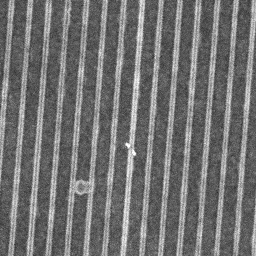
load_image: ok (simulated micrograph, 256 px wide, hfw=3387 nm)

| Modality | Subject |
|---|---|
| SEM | parallel lines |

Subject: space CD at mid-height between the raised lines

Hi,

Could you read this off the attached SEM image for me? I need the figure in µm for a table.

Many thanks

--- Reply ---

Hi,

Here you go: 0.201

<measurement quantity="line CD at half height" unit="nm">44.5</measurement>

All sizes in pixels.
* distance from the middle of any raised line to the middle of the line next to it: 18.6